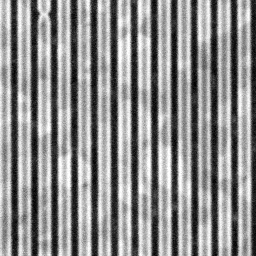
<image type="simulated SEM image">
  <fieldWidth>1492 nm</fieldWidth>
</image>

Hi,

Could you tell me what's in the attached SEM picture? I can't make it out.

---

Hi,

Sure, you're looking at parallel lines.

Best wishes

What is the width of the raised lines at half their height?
10.5 pixels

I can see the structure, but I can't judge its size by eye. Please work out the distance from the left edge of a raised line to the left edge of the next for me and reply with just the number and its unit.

117 nanometres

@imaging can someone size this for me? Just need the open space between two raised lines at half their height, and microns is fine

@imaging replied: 0.0561